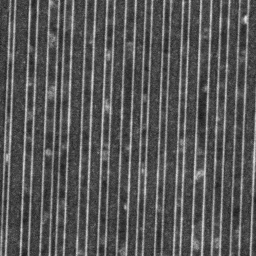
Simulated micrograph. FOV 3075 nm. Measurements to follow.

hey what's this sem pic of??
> parallel lines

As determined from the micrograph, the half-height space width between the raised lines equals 132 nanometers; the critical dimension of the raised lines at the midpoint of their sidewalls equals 100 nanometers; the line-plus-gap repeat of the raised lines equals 231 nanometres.